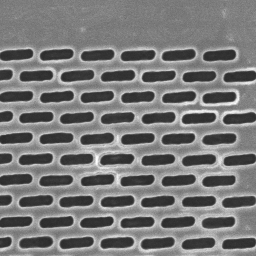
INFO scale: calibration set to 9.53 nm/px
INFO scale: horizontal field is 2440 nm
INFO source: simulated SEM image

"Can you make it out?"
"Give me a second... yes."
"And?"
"a regular array of holes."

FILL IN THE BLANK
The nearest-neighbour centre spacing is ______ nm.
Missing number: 274